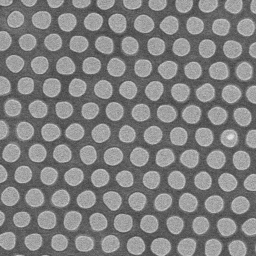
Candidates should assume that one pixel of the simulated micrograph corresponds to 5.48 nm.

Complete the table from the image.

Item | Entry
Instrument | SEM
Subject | an array of small figures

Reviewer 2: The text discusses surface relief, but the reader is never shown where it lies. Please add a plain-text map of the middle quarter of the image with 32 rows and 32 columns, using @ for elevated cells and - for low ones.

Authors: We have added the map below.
@@@--@@@@--@@@@---@@@@--@@@@---@
@@@--@@@@--@@@@---@@@@--@@@@--@@
------------@@@---@@@---@@@@--@@
-------------------------@@----@
--@@@----@@----@@-----@@--------
-@@@@---@@@@--@@@@---@@@@--@@@@-
-@@@@---@@@@--@@@@--@@@@@--@@@@-
--@@@---@@@@--@@@@---@@@---@@@@-
---------@@-----@----@@@----@@@-
--------------------------------
@@---@@@---@@@----@@@---@@-----@
@@---@@@@--@@@@--@@@@--@@@@@--@@
@@---@@@---@@@@--@@@@--@@@@@--@@
@----@@----@@@---@@@@---@@@@--@@
-------------------------------@
-@@@----@@@----@----------------
-@@@@--@@@@---@@@----@@@---@@@--
@@@@@--@@@@---@@@@--@@@@---@@@@-
-@@@---@@@@---@@@@--@@@@---@@@@-
--------@------------@@@---@@@--
------@-------------------------
@---@@@@---@@@---@@@----@@-----@
@@--@@@@--@@@@@--@@@@--@@@@---@@
@@--@@@@--@@@@@--@@@@--@@@@--@@@
-----@@---@@@@---@@@@--@@@@--@@@
------------------------@------@
-@@@----@@----------------------
@@@@@--@@@@--@@@@---@@@@---@@---
@@@@@--@@@@--@@@@---@@@@--@@@@--
-@@@---@@@@--@@@@---@@@@--@@@@--
--------@@-----@@---@@@----@@@--
--------------------------------